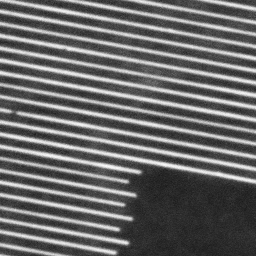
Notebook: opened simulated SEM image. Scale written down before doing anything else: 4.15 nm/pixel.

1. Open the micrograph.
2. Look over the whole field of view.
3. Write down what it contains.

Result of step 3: parallel lines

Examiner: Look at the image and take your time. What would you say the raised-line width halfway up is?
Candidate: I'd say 11.7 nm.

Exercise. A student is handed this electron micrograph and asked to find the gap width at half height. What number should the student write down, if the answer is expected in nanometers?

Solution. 38.7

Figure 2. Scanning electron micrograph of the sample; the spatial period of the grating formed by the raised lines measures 50 nm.